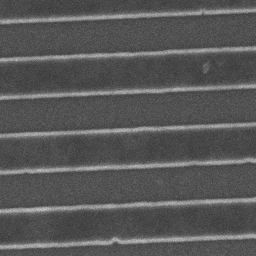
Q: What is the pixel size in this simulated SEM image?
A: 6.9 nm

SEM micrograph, one or a few lines or trenches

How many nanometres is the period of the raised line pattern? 519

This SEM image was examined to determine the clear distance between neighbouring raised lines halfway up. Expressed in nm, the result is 258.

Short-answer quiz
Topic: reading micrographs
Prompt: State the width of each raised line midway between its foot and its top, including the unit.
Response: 264 nm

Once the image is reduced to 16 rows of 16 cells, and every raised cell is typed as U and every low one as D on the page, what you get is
UUUUUUUUUUUUUUUU
DDDDDDDDDDDDDDDD
DDDDDDDDDDDDDDDD
DDDDDUUUUUUUUUUU
UUUUUUUUUUUUUUUU
UUUUUUUUUUUUUUDD
DDDDDDDDDDDDDDDD
DDDDDDDDDDDDDDDD
UUUUUUUUUUUUUUUU
UUUUUUUUUUUUUUUU
UUUUUUUDDDDDDDDD
DDDDDDDDDDDDDDDD
DDDDDDDDDDDDDDDU
UUUUUUUUUUUUUUUU
UUUUUUUUUUUUUUUU
DDDDDDDDDDDDDDDD